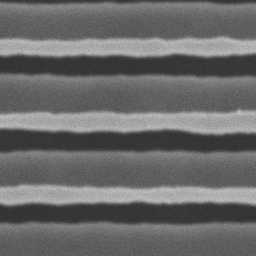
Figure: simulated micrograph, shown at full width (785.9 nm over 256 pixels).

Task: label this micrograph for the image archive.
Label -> lines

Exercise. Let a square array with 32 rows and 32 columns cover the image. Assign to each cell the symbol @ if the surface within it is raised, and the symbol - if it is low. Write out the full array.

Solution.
@------------@---@@@@@@@@@@-----
@@@@@@@@@@@@@@@@@@@@@@@@@@@@@@@@
@@@@@@@@@@@@@@@@@@@@@@@@@@@@@@@@
@@@@@@@@@@@@@@@@@@@@@@@@@@@@@@@@
@@@@@@@@@@@@@@@@@@@@@@@@@@@@@@@@
@@@@@@@@@@@@@@@@@@@@@@@@@@@@@@@@
@@@@@@@@@@@@@@@@@@@@@@@@@@@@@@@@
--------------------------------
--------------------------------
@@@@@@@-------@@-@@@@-----------
@@@@@@@@@@@@@@@@@@@@@@@@@@@@@@@@
@@@@@@@@@@@@@@@@@@@@@@@@@@@@@@@@
@@@@@@@@@@@@@@@@@@@@@@@@@@@@@@@@
@@@@@@@@@@@@@@@@@@@@@@@@@@@@@@@@
@@@@@@@@@@@@@@@@@@@@@@@@@@@@@@@@
@@@@@@@@@@@@@@@@@@@@@@@@@@@@@@@@
------------------------@@@@@@@@
--------------------------------
--------------------------------
@@@@@@@@@@@@@@@@@@@@@@@@@@@@@@@@
@@@@@@@@@@@@@@@@@@@@@@@@@@@@@@@@
@@@@@@@@@@@@@@@@@@@@@@@@@@@@@@@@
@@@@@@@@@@@@@@@@@@@@@@@@@@@@@@@@
@@@@@@@@@@@@@@@@@@@@@@@@@@@@@@@@
@@@@@@@@@@@@@@@@@@@@@@@@@@@@@@@@
@@@----@-----------------------@
--------------------------------
--------------------------------
@@@@@@@@@@@@@@@@@@@@@@@@@@@@@@@@
@@@@@@@@@@@@@@@@@@@@@@@@@@@@@@@@
@@@@@@@@@@@@@@@@@@@@@@@@@@@@@@@@
@@@@@@@@@@@@@@@@@@@@@@@@@@@@@@@@